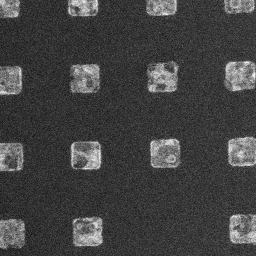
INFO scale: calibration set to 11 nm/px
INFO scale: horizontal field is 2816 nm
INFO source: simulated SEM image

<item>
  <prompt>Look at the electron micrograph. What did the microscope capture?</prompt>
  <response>raised bodies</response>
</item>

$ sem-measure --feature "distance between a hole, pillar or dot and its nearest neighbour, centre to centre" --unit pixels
76.3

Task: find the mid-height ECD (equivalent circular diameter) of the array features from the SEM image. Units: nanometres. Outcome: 340